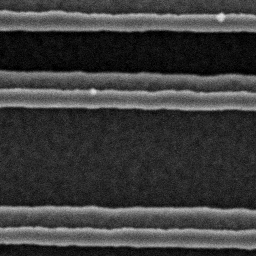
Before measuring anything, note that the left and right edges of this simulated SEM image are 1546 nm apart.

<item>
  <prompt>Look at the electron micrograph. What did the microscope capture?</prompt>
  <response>lines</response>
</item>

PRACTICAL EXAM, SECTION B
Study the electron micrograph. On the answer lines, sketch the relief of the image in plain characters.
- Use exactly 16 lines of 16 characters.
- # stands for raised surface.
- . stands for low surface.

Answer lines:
################
################
................
................
#...............
################
################
................
................
................
................
................
................
################
################
.............#.#